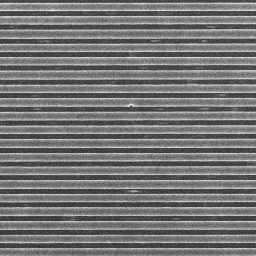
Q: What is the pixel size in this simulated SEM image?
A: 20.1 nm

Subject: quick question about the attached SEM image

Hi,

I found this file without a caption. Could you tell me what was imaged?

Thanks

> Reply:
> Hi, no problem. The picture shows parallel lines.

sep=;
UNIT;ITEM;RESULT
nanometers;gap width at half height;108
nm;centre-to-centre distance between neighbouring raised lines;275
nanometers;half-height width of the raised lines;161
